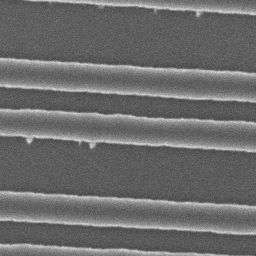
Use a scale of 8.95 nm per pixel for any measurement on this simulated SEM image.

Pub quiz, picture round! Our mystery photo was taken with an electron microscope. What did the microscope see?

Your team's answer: lines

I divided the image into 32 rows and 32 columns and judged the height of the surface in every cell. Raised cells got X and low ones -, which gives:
------------XXXXXXXXXXXXXXXXXXXX
---------------------------XXXXX
--------------------------------
--------------------------------
--------------------------------
--------------------------------
--------------------------------
XX------------------------------
XXXXXXXXXXXXXXXXXXX-------------
XXXXXXXXXXXXXXXXXXXXXXXXXXXXXXXX
XXXXXXXXXXXXXXXXXXXXXXXXXXXXXXXX
------------XXXXXXXXXXXXXXXXXXXX
-----------------------------XXX
--------------------------------
XXXXXXXXXXXXXXXXX---------------
XXXXXXXXXXXXXXXXXXXXXXXXXXXXXXXX
XXXXXXXXXXXXXXXXXXXXXXXXXXXXXXXX
---------XXXXXXXXXXXXXXXXXXXXXXX
-------------------------XXXXXXX
--------------------------------
--------------------------------
--------------------------------
--------------------------------
--------------------------------
XXXXXXXXXX----------------------
XXXXXXXXXXXXXXXXXXXXXXXXXXX-----
XXXXXXXXXXXXXXXXXXXXXXXXXXXXXXXX
-XXXXXXXXXXXXXXXXXXXXXXXXXXXXXXX
--------------------XXXXXXXXXXXX
--------------------------------
--------------------------------
XXXXXXXXXXXXXXXXXX--------------